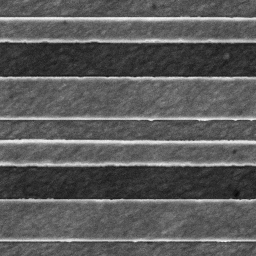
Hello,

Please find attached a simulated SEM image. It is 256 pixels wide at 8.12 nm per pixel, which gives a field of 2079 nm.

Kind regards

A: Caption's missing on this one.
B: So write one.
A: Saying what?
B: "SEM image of lines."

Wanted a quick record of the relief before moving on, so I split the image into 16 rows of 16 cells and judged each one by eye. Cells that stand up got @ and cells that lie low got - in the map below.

@@@@@@@@@@@@@@@@
@@@@@@@@@@@@@@@@
@@@@@@@@@@@@@@@@
----------------
----------------
@@@@@@@@@@@@@@@@
@@@@@@@@@@@@@@@@
@@@@@@@@@@@@@@@@
@@@@@@@@@@@@@@@@
@@@@@@@@@@@@@@@@
----------------
----------------
@@@@@@@@@@@@@@@@
@@@@@@@@@@@@@@@@
@@@@@@@@@@@@@@@@
@@@@@@@@@@@@@@@@